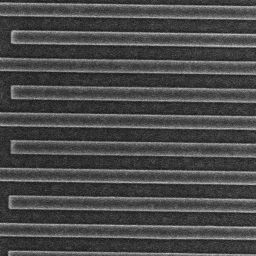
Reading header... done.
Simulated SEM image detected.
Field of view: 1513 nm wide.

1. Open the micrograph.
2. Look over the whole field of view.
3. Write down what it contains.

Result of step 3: parallel lines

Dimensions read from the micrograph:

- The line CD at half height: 76.1 nm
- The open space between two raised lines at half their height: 86.5 nanometres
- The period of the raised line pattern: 163 nm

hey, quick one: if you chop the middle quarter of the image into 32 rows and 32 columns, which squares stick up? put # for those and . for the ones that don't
################################
################################
................................
................................
................................
................................
################################
################################
################################
................................
................................
................................
#####...........................
################################
################################
################################
................................
................................
................................
#############...................
################################
################################
################################
................................
................................
................................
#######.........................
################################
################################
........########################
................................
................................